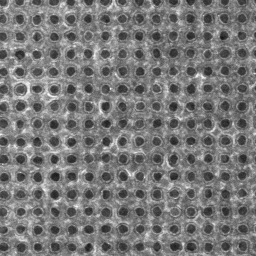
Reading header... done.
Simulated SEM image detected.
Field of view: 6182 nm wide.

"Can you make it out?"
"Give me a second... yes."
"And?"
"a regular array of raised bodies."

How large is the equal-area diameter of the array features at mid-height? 0.248 µm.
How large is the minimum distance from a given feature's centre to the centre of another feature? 0.406 micrometres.